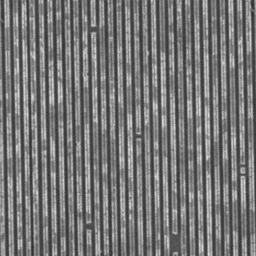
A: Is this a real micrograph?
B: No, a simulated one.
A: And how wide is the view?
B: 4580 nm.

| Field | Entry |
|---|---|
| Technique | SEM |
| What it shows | parallel lines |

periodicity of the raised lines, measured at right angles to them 8.62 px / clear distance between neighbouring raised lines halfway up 78.3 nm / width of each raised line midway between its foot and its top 4.38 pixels